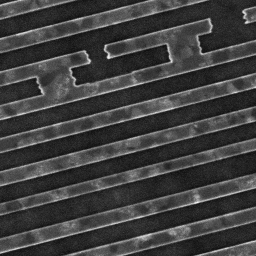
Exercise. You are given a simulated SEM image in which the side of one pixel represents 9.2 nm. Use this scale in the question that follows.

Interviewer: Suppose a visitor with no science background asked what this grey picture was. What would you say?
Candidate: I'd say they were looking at parallel lines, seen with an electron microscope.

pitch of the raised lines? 297 nm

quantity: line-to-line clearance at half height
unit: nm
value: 165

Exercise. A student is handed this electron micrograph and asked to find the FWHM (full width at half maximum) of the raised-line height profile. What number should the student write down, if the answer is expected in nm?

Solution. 129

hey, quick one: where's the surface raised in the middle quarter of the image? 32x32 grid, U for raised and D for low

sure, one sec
UUUUDDDDDDDDDDDDDDDDDDDUUUUUUUUU
UUDDDDDDDDDDDDDDDDDUUUUUUUUUUUUU
UUDDDDDDDDDDDDDDUUUUUUUUUUUUUDDD
UUDDDDDDDDDDUUUUUUUUUUUUUDDDDDDD
UUUDDDDDUUUUUUUUUUUUUDDDDDDDDDDD
UUUUUUUUUUUUUUUUUDDDDDDDDDDDDDDD
UUUUUUUUUUUUUDDDDDDDDDDDDDDDDDDD
UUUUUUUUUUDDDDDDDDDDDDDDDDDDUUUU
UUUUUUDDDDDDDDDDDDDDDDDDUUUUUUUU
UUDDDDDDDDDDDDDDDDDDUUUUUUUUUUUU
DDDDDDDDDDDDDDDDUUUUUUUUUUUUUUDD
DDDDDDDDDDDDUUUUUUUUUUUUUUDDDDDD
DDDDDDDDUUUUUUUUUUUUUUDDDDDDDDDD
DDDDUUUUUUUUUUUUUUDDDDDDDDDDDDDD
UUUUUUUUUUUUUUDDDDDDDDDDDDDDDDDD
UUUUUUUUUUDDDDDDDDDDDDDDDDDDDUUU
UUUUUUDDDDDDDDDDDDDDDDDDDUUUUUUU
UUUDDDDDDDDDDDDDDDDDDUUUUUUUUUUU
DDDDDDDDDDDDDDDDDUUUUUUUUUUUUUUD
DDDDDDDDDDDDDUUUUUUUUUUUUUUDDDDD
DDDDDDDDDUUUUUUUUUUUUUUDDDDDDDDD
DDDDDUUUUUUUUUUUUUUDDDDDDDDDDDDD
DUUUUUUUUUUUUUUDDDDDDDDDDDDDDDDD
UUUUUUUUUUUUDDDDDDDDDDDDDDDDDUUU
UUUUUUUUDDDDDDDDDDDDDDDDDUUUUUUU
UUUUDDDDDDDDDDDDDDDDDUUUUUUUUUUU
DDDDDDDDDDDDDDDDDUUUUUUUUUUUDDDD
DDDDDDDDDDDDDUUUUUUUUUUUDDDDDDDD
DDDDDDDDDUUUUUUUUUUUUDDDDDDDDDDD
DDDDDUUUUUUUUUUUUDDDDDDDDDDDDDDD
DUUUUUUUUUUUUDDDDDDDDDDDDDDDDDDD
UUUUUUUUUDDDDDDDDDDDDDDDDDDDDDDD